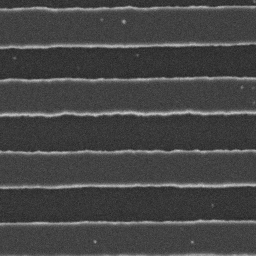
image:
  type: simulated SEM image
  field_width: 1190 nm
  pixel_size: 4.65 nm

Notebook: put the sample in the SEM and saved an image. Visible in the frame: lines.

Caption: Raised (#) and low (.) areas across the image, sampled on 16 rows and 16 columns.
..#....#########
################
################
................
................
################
################
................
................
#....#.#########
################
################
................
................
################
################